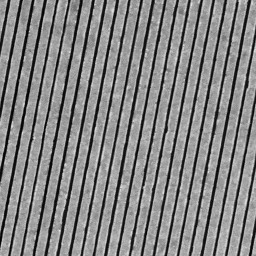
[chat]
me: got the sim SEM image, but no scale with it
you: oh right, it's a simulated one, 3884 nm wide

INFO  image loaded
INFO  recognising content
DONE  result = parallel lines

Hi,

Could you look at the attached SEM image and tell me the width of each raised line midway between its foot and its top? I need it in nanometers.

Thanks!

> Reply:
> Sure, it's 121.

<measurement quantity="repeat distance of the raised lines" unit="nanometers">179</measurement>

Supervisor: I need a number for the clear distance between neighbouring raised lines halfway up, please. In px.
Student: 3.94